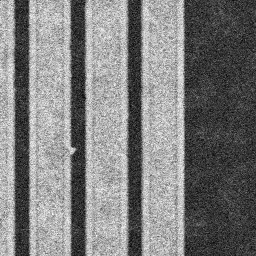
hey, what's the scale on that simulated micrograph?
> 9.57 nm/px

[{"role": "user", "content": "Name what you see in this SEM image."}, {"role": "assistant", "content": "parallel lines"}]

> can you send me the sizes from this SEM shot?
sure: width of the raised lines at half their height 338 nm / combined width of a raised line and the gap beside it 542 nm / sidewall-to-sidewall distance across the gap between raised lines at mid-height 0.207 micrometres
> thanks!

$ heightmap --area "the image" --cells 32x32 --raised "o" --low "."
o...oooo...oooo...ooooo.........
o...oooo...oooo...ooooo.........
o...oooo...oooo...ooooo.........
o...oooo...oooo...ooooo.........
o...oooo...oooo...ooooo.........
o...oooo...oooo...ooooo.........
o...oooo...oooo...ooooo.........
o...oooo...oooo...ooooo.........
o...oooo...oooo...ooooo.........
o...oooo...oooo...ooooo.........
o...oooo...oooo...ooooo.........
o...oooo...oooo...ooooo.........
o...oooo...oooo...ooooo.........
o...oooo...oooo...ooooo.........
o...oooo...ooooo..ooooo.........
o...oooo...oooo...ooooo.........
o...oooo...oooo...ooooo.........
o...oooo...oooo...ooooo.........
o...ooooo..oooo...ooooo.........
o...ooooo..oooo...ooooo.........
o...oooo...oooo...ooooo.........
o...oooo...oooo...ooooo.........
o...oooo...oooo...ooooo.........
o...oooo...oooo...ooooo.........
o...oooo...oooo...ooooo.........
o...oooo...oooo...ooooo.........
o...oooo...oooo...ooooo.........
o...oooo...oooo...ooooo.........
o...oooo...oooo...oooo..........
o...oooo...oooo...ooooo.........
o...oooo...oooo...ooooo.........
o...oooo...oooo...ooooo.........